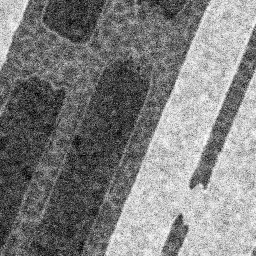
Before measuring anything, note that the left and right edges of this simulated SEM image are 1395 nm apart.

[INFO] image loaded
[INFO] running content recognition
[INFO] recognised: one or a few lines or trenches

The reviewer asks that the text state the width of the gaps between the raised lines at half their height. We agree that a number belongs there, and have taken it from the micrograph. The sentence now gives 21.7 pixels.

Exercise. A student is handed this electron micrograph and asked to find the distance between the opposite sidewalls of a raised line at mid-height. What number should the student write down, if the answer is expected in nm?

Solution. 275